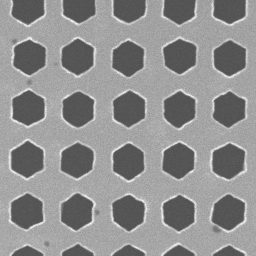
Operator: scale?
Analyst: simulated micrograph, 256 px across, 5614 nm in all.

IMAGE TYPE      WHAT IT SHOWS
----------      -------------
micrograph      a regular array of holes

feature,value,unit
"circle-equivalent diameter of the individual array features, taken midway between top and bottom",738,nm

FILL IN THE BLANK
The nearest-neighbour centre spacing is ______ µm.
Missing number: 1.09